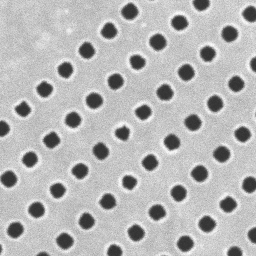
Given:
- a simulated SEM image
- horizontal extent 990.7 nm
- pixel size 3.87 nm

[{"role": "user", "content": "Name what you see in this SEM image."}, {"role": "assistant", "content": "a regular array of holes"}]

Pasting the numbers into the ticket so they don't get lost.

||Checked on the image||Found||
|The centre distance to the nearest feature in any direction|111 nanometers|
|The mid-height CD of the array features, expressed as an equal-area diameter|0.0601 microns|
